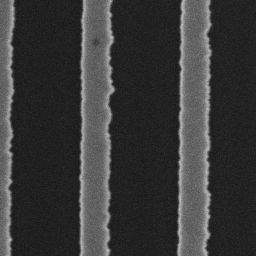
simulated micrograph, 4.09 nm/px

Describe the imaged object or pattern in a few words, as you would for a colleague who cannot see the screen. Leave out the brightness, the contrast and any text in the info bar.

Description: lines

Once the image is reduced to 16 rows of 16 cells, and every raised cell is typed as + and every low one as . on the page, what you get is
+....++....++...
+....++....++...
+....++....++...
+....++....++...
+....++....++...
+....++....++...
+....++....++...
+....++....++...
+....++....++...
+....++....++...
+....++....++...
+....++....++...
+....++....++...
+....++....++...
+....++....++...
+....++....++...